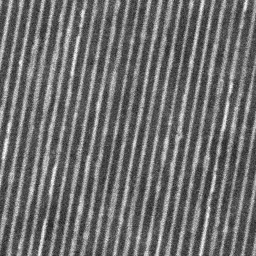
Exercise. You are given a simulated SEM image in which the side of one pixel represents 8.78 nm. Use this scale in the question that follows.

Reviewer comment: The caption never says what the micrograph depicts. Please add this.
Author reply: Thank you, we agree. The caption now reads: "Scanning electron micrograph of parallel lines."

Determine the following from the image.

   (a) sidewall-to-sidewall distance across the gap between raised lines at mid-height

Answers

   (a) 73.5 nm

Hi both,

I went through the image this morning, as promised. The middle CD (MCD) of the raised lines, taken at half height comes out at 24.9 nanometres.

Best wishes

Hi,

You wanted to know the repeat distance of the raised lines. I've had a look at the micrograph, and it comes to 92 nm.